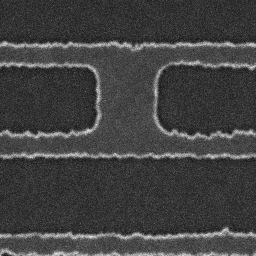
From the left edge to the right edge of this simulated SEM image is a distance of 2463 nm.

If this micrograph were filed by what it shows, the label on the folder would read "one or a few lines or trenches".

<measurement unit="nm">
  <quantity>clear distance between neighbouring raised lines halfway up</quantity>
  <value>734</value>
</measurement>